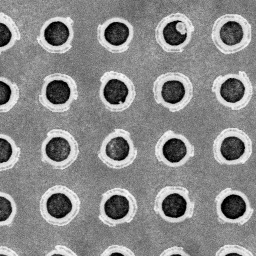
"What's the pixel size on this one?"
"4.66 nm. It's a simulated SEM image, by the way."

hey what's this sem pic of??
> a regular array of holes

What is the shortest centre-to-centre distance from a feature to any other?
265 nm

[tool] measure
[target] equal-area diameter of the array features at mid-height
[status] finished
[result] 130 nm